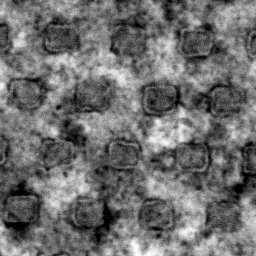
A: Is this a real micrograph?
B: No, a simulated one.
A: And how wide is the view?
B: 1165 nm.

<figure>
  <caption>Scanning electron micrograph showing a regular array of raised bodies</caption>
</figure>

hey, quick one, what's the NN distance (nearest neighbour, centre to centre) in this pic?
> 301 nanometers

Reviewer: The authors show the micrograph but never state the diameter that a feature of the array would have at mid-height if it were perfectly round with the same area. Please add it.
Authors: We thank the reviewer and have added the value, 139 nanometres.